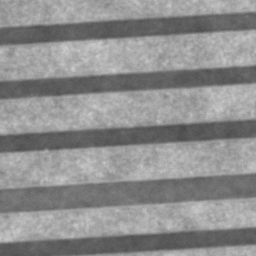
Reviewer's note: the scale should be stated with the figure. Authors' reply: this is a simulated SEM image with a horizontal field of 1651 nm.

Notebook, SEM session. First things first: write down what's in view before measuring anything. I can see parallel lines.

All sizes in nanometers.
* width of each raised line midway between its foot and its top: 224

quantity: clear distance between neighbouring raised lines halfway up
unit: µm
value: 0.121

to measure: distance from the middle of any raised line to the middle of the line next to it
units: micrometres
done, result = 0.354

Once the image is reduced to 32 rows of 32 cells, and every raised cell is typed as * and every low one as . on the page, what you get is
********************************
******************************..
**************..................
................................
.....................***********
.....***************************
********************************
********************************
**************************......
**********......................
................................
................****************
********************************
********************************
********************************
**********************..........
****............................
...........................*****
...........*.*******************
********************************
********************************
********************************
****************................
................................
................................
.....................***********
.....***************************
********************************
****************************....
************....................
................................
...................*************